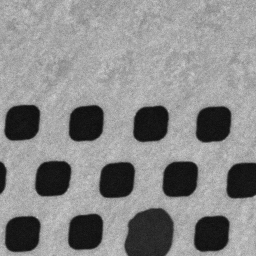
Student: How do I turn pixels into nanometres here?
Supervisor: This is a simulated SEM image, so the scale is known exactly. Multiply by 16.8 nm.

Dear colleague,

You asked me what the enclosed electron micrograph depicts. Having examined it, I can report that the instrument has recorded a regular array of holes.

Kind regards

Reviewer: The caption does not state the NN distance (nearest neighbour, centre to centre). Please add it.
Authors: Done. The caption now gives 1050 nanometres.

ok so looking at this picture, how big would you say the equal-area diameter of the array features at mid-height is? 630 nanometers